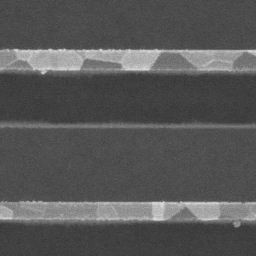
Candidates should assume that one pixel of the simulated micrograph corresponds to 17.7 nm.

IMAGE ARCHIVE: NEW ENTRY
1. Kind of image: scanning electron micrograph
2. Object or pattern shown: lines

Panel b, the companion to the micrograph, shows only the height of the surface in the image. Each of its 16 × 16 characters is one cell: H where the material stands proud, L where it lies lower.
HHHHHHHHHHHHHHHH
HHHHHHHHHHHHHHHH
HHHHHHHHHHHHHHHH
HHHHHHHHHHHHHHHH
LLLLLLLLLLLLLLLL
LLLLLLLLLLLLLLLL
LLLLLLLLLLLLLLLL
LLLLLLLLLLLLLLLL
HHHHHHHHHHHHHHHH
HHHHHHHHHHHHHHHH
HHHHHHHHHHHHHHHH
HHHHHHHHHHHHHHHH
HHHHHHHHHHHHHHHH
HHHHHHHHHHHHHHHH
LLLLLLLLLLLLLLLL
LLLLLLLLLLLLLLLL